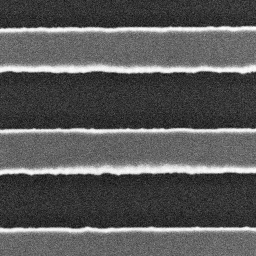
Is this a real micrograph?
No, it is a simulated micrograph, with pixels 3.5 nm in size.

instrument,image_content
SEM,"lines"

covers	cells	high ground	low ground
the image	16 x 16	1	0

0000000000000000
0000000000000000
1111111111111111
1111111111111111
0000100110100001
0000000000000000
0000000000000000
0000000000000000
1111111111111111
1111111111111111
1111111111111111
0000000000000000
0000000000000000
0000000000000000
1111111111111111
1111111111111111